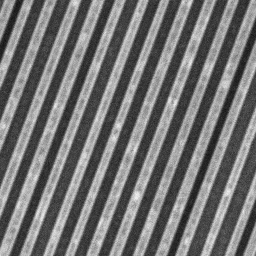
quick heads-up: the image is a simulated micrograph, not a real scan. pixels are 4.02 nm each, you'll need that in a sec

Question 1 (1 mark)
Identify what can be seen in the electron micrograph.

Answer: parallel lines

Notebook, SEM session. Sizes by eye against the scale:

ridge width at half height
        35.3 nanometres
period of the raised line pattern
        0.085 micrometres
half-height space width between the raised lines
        50.4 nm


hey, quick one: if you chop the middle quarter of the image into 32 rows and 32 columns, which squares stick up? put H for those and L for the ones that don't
LHHHLLLHHLLLLHHLLLHHLLLHHHLLLHHH
LHHLLLHHHLLLHHLLLLHHLLLHHHLLLHHL
HHHLLLHHLLLLHHLLLHHLLLLHHLLLLHHL
HHHLLLHHLLLLHHLLLHHLLLHHHLLLHHHL
HHLLLHHLLLLHHLLLLHHLLLHHLLLLHHLL
HHLLLHHLLLLHHLLLHHLLLLHHLLLHHHLL
HHLLHHHLLLLHHLLLHHLLLHHHLLLHHLLL
HLLLHHLLLLHHLLLHHLLLLHHLLLHHHLLL
HLLLHHLLLLHHLLLHHLLLHHHLLLHHHLLL
LLLHHHLLLHHHLLLHHLLLHHHLLLHHLLLL
LLLHHLLLLHHLLLHHLLLLHHLLLHHHLLLH
LLLHHLLLLHHLLLHHLLLHHHLLLHHHLLLH
LLHHLLLLHHLLLLHHLLLHHLLLLHHLLLLH
LLHHLLLLHHLLLHHLLLLHHLLLHHHLLLHH
LHHHLLLLHHLLLHHLLLHHHLLLHHLLLLHH
LHHLLLLHHLLLLHLLLLHHLLLHHHLLLHHH
LHHLLLLHHLLLHHLLLHHHLLLHHHLLLHHH
HHHLLLHHHLLLHHLLLHHHLLLHHLLLLHHL
HHLLLLHHLLLLHLLLLHHLLLHHHLLLHHHL
HHLLLLHHLLLHHLLLHHHLLLHHHLLLHHLL
HLLLLHHLLLLHHLLLHHLLLLHHLLLLHHLL
HLLLLHHLLLHHLLLLHHLLLHHHLLLHHHLL
HLLLLHHLLLHHLLLHHHLLLHHLLLLHHLLL
LLLLHHLLLLHLLLLHHLLLHHHLLLHHHLLL
LLLLHHLLLHHLLLHHHLLLHHHLLLHHHLLL
LLLLHHLLLHHLLLHHHLLLHHLLLLHHLLLH
LLLHHLLLHHLLLLHHLLLHHHLLLHHHLLLH
LLLHHLLLHHLLLHHHLLLHHHLLLHHLLLLH
LLHHLLLLHHLLLHHLLLLHHLLLLHHLLLHH
LLHHLLLHHLLLLHHLLLHHHLLLHHHLLLHH
LLHHLLLHHLLLHHHLLLHHLLLLHHLLLHHH
LHHLLLHHLLLLHHLLLLHHLLLHHHLLLHHH